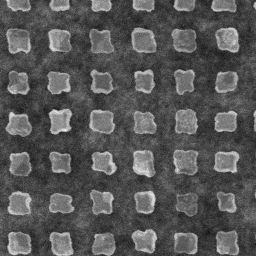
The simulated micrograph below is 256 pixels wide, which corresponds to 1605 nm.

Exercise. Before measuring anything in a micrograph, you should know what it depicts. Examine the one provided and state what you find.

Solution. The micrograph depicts a regular array of raised bodies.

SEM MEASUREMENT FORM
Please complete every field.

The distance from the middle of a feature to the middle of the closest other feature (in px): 39.5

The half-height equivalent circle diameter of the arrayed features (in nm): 145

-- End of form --